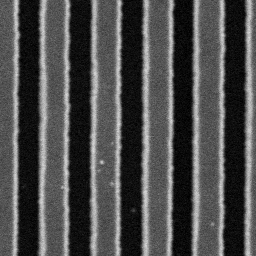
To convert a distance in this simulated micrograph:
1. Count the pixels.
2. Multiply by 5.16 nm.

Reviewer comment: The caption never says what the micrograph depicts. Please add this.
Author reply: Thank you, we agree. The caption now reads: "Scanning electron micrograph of lines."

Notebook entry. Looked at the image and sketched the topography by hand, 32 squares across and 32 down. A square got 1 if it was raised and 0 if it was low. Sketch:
11000111100111100011110011110001
11000111100111100011110011110001
11000111100111100011110011110001
11000111100111100011110011110001
11000111100111100011110011110001
11000111100111100011110011110001
11000111100111100011110011110001
11000111100111100011110011110001
11000111100111100011110011110001
11000111100111100011110011110001
11000111100111100011110011110001
11000111100111100011110011110001
11000111100111100011110011110001
11000111100111100011110011110001
11000111100111100011110011110001
11000111100111100011110011110001
11000111100111100011110011110001
11000111100111100011110011110001
11000111100111100011110011110001
11000111100111100011110011110001
11000111100111100011110011110001
11000111100111100011110011110001
11000111100111100011110011110001
11000111100111100011100011110001
11000111100111100011100011110001
11000111100111100011110011110001
11000111100111100011100011110001
11000111100111100011100011110001
11000111100111100011110011110001
11000111100111100011110011110001
11000111100111100011100011110001
11000111100111100011100011110001